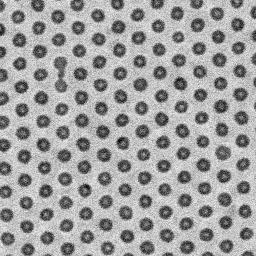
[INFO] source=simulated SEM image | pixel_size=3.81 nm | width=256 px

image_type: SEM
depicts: a regular array of ring-shaped grooves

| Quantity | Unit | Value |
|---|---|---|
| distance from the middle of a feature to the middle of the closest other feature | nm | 85.8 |